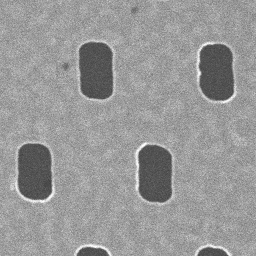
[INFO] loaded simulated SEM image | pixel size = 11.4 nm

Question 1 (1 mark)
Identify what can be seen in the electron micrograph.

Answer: holes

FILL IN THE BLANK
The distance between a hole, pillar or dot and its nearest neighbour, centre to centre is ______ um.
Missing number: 1.35